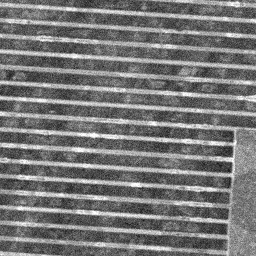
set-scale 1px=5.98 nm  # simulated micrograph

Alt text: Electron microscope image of parallel lines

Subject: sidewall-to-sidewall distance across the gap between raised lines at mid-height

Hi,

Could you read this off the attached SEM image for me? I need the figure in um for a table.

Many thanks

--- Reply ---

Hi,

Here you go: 0.0739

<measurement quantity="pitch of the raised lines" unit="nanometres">93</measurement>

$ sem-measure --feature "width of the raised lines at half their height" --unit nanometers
17.2